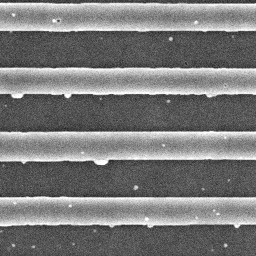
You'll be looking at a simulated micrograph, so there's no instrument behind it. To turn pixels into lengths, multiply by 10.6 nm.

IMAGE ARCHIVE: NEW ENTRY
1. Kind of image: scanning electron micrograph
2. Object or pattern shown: lines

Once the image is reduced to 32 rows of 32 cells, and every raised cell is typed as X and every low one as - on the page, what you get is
XXXXXX--------------------------
XXXXXXXXXXXXXXXXXXXXXXXXXXXXXXXX
XXXXXXXXXXXXXXXXXXXXXXXXXXXXXXXX
XXXXXXXXXXXXXXXXXXXXXXXXXXXXXXXX
--------------------------------
--------------------------------
--------------------------------
--------------------------------
--------------------------------
XXXXXXXXXXXXXXXXXXXXXXXXXXXXXXXX
XXXXXXXXXXXXXXXXXXXXXXXXXXXXXXXX
XXXXXXXXXXXXXXXXXXXXXXXXXXXXXXXX
--------------------------------
--------------------------------
--------------------------------
--------------------------------
--------------------------------
XXXXXXXXXXXXXXXXXXXXXXXXXXXXXXXX
XXXXXXXXXXXXXXXXXXXXXXXXXXXXXXXX
XXXXXXXXXXXXXXXXXXXXXXXXXXXXXXXX
------------X-------------------
--------------------------------
--------------------------------
--------------------------------
--------------------------------
XXXXXXXXXXXXXXXXXXXXXXXXXXXXXXXX
XXXXXXXXXXXXXXXXXXXXXXXXXXXXXXXX
XXXXXXXXXXXXXXXXXXXXXXXXXXXXXXXX
--------------------------------
--------------------------------
--------------------------------
--------------------------------